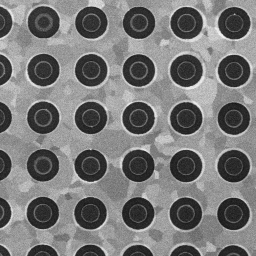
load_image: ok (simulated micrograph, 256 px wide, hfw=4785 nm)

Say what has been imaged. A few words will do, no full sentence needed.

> an array of small figures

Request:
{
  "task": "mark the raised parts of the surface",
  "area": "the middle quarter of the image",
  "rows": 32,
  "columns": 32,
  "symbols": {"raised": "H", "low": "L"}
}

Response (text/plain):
HHHLLHHHHLLHHHHLLHHHLLLHHHLLLHHH
HHHLLHHHHLLHHHLLLHHHHLLHHHLLLHHH
HHHLLHHHLLLHHHHLLHHHHLLHHHLLLHHH
HHHLLLHLLLLHHHHLLLLLLLLHHHHLLLHH
HHHHLLLLLLHHHHHHLLLLLLHHHHHLLLLL
HHHHHLLLLHHHHHHHHLLLLHHHHHHHLLLL
HHHHHHHHHHHHHHHHHHHHHHHHHHHHHHHH
HHHHHHHHHHHHHHHHHHHHHHHHHHHHHHHH
HHHHHHHHHHHHHHHHHHHHHHHHHHHHHHHH
HHHHHLLLLHHHHHHHHLLLHHHHHHHHHHLL
HHHHLLLLLLHHHHHHLLLLLLHHHHHLLLLL
HHHLLLLLLLLHHHHLLLLLLLLHHHHLLLHL
HHHLLHHHLLLHHHHLLHHHLLLHHHLLLHHH
HHLLLHHHHLLHHHLLLHHHHLLHHHLLLHHH
HHHLLHHHHLLHHHHLLHHHLLLHHHLLLHHH
HHHLLLHLLLHHHHHLLLHLLLHHHHHLLLHH
HHHHLLLLLLHHHHHHLLLLLLHHHHHLLLLL
HHHHHHLLHHHHHHHHHLLLHHHHHHHHHLLL
HHHHHHHHHHHHHHHHHHHHHHHHHHHHHHHH
HHHHHHHHHHHHHHHHHHHHHHHHHHHHHHHH
HHHHHHHHHHHHHHHHHHHHHHHHHHHHHHHH
HHHHHLLLHHHHHHHHLLLLHHHHHHHHHLLL
HHHHLLLLLLHHHHHLLLLLLLHHHHHHLLLL
HHHLLLLLLLLHHHHLLLHLLLHHHHHLLLHL
HHHLLHHHLLLHHHLLLHHHLLLHHHHLLHHH
HHLLLHHHHLLHHHLLHHHHHLLHHHLLHHHH
HHHLLHHHHLLHHHHLLHHHLLLHHHHLLHHH
HHHLLLHLLLHHHHHLLLLLLLHHHHHLLLHL
HHHHLLLLLLHHHHHHLLLLLHHHHHHHLLLL
HHHHHLLLHHHHHHHHHLLLHHHHHHHHHLLL
HHHHHHHHHHHHHHHHHHHHHHHHHHHHHHHH
HHHHHHHHHHHHHHHHHHHHHHHHHHHHHHHH